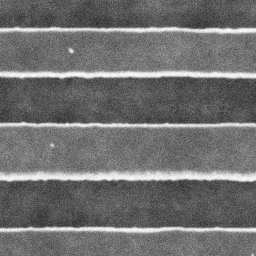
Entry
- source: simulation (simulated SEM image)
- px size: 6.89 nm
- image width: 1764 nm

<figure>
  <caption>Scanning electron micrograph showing lines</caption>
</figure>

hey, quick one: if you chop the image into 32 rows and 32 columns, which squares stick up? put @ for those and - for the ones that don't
--------------------------------
--------------------------------
--------------------------------
--------------------------------
@@@@@@@@@@@@@@@@@@@@@@@@@@@@@@@@
@@@@@@@@@@@@@@@@@@@@@@@@@@@@@@@@
@@@@@@@@@@@@@@@@@@@@@@@@@@@@@@@@
@@@@@@@@@@@@@@@@@@@@@@@@@@@@@@@@
@@@@@@@@@@@@@@@@@@@@@@@@@@@@@@@@
-------------------------------@
--------------------------------
--------------------------------
--------------------------------
--------------------------------
--------------------------------
@@@@@@@--@-@@--------------@@@-@
@@@@@@@@@@@@@@@@@@@@@@@@@@@@@@@@
@@@@@@@@@@@@@@@@@@@@@@@@@@@@@@@@
@@@@@@@@@@@@@@@@@@@@@@@@@@@@@@@@
@@@@@@@@@@@@@@@@@@@@@@@@@@@@@@@@
@@@@@@@@@@@@@@@@@@@@@@@@@@@@@@@@
@@@@@@@@@@@@@@@@@@@@@@@@@@@@@@@@
--------------------------------
--------------------------------
--------------------------------
--------------------------------
--------------------------------
--------------------------------
---------------------@@---------
@@@@@@@@@@@@@@@@@@@@@@@@@@@@@@@@
@@@@@@@@@@@@@@@@@@@@@@@@@@@@@@@@
@@@@@@@@@@@@@@@@@@@@@@@@@@@@@@@@